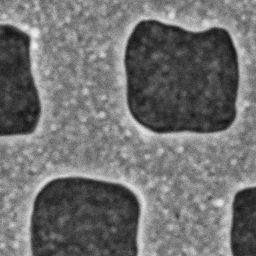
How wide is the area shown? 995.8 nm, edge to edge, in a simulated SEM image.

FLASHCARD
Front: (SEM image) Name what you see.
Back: holes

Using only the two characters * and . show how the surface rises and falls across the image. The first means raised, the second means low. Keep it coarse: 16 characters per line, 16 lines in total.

****************
*********..*****
..******.......*
..******.......*
..******.......*
..******.......*
...*****.......*
..******.......*
.***************
****************
****************
***.....********
**.......******.
**.......*****..
**.......*****..
**.......*****..